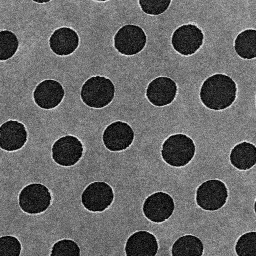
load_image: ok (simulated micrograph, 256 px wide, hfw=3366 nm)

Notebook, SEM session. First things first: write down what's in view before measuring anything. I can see a regular array of holes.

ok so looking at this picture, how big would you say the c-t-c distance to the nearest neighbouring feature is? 721 nm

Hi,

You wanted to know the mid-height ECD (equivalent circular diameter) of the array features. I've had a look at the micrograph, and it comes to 0.409 µm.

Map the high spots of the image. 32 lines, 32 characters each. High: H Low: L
HHHHHHHHHHHHHHHHHLLLLHHHHHHHHHHH
HHHHHHHHHHHHHHHHHHLLHHHHHHHHHHHH
HHHHHHHHHHHHHHHHHHHHHHHHHHHHHHHH
HHHHHHHHLHHHHHHLLLHHHHLLLHHHHHHH
LLHHHHLLLLHHHHLLLLHHHHLLLHHHHHLL
LLHHHHLLLLHHHHLLLLHHHHLLLHHHHLLL
LLHHHHHLLHHHHHHLLHHHHHLLHHHHHHLL
LHHHHHHHHHHHHHHHHHHHHHHHHHHHHHHH
HHHHHHHHHHHHHHHHHHHHHHHHHHHHHHHH
HHHHHHHHHHHHHHHHHHHHHHHHHHLLHHHH
HHHHHLLLHHLLLLHHHHHLLLHHHLLLLHHH
HHHHLLLLHHLLLLHHHHLLLLHHHLLLLLHH
HHHHLLLLHHLLLLHHHHHLLLHHHLLLLHHH
HHHHHLLHHHHHLHHHHHHHHHHHHHLLHHHH
HHHHHHHHHHHHHHHHHHHHHHHHHHHHHHHH
LLLHHHHHHHHHHHLLHHHHHHHHHHHHHHHH
LLLHHHHHHHHHHLLLLHHHHHHHHHHHHHHH
LLLHHHHLLLHHHLLLLHHHHLLLHHHHHHHH
LLLHHHHLLLHHHLLLHHHHLLLLHHHHHLLL
HHHHHHHLLLHHHHHHHHHHLLLLHHHHHLLL
HHHHHHHLLHHHHHHHHHHHHLLHHHHHHLLL
HHHHHHHHHHHHHHHHHHHHHHHHHHHHHHHH
HHHHHHHHHHHHHHHHHHHHHHHHHHLHHHHH
HHHLLLHHHHHLLLHHHHHHHHHHHLLLHHHH
HHLLLLHHHHLLLLHHHHHLLHHHHLLLHHHH
HHLLLLHHHHLLLLHHHHLLLLHHHLLLHHHH
HHHLLHHHHHHHHHHHHHLLLLHHHHHHHHHH
HHHHHHHHHHHHHHHHHHHLLHHHHHHHHHHH
HHHHHHHHHHHHHHHHHHHHHHHHHHHHHHHH
HHHHHHHHHHHHHHHHLLLHHHHLHHHHHHLL
LLLHHHHLLLHHHHHHLLLLHHLLLHHHHLLL
LLLHHHLLLLHHHHHHLLLLHLLLLHHHHLLL